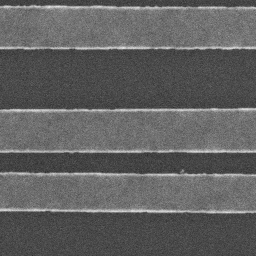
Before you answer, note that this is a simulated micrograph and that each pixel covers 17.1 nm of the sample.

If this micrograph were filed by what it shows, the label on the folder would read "lines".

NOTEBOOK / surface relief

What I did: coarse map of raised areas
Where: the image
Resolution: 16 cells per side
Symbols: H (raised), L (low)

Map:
HHHHHHHHHHHHHHHH
HHHHHHHHHHHHHHHH
HHHHHHHHHHHHHHHH
LLLLLLLLLLLLLLLL
LLLLLLLLLLLLLLLL
LLLLLLLLLLLLLLLL
LLLLLLLLLLLLLLLL
HHHHHHHHHHHHHHHH
HHHHHHHHHHHHHHHH
LLLLLLLLLLLLLLLL
LLLLLLLLLLLLLLLL
HHHHHHHHHHHHHHHH
HHHHHHHHHHHHHHHH
LLLLLLLLLLLLLLLL
LLLLLLLLLLLLLLLL
LLLLLLLLLLLLLLLL